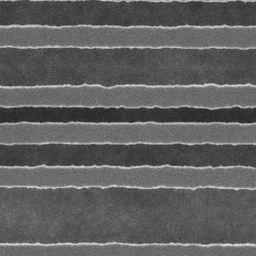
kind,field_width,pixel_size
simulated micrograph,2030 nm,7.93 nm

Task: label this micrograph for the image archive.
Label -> lines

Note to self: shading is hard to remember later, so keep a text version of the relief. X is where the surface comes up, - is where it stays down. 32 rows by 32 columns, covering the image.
--------------------------------
--------------------------------
--------------------------------
XXXXXXXXXXXXXXXXXXXXXXXXXXXXXXXX
XXXXXXXXXXXXXXXXXXXXXXXXXXXXXXXX
XXXXXXXXXXXXXXXXXXXXXXXXXXXXXXXX
--------------------------------
--------------------------------
--------------------------------
--------------------------------
--------------------------------
XXXXXXXXXXXXXXXXXXXXXXXXXXXXXXXX
XXXXXXXXXXXXXXXXXXXXXXXXXXXXXXXX
-------------------------XXX----
--------------------------------
XXXXXXXXXXXXXXXXXXXXXXXXXXXXXXXX
XXXXXXXXXXXXXXXXXXXXXXXXXXXXXXXX
XXXXXXXXXXXXXXXXXXXXXXXXXXXXXXXX
--------------------------------
--------------------------------
--------------------------------
XXXXXXXXXXXXXXXXXXXXXXXXXXXXXXXX
XXXXXXXXXXXXXXXXXXXXXXXXXXXXXXXX
-----XX--X-------XXX--XXX--XXXXX
--------------------------------
--------------------------------
--------------------------------
--------------------------------
--------------------------------
--------------------------------
X-XXX--XXXXXXXXX-----X----------
XXXXXXXXXXXXXXXXXXXXXXXXXXXXXXXX